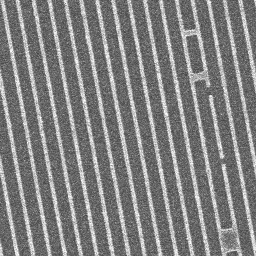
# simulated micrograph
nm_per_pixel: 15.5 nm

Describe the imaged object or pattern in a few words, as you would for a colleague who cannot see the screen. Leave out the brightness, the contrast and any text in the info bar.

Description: parallel lines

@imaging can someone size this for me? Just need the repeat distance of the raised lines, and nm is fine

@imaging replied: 242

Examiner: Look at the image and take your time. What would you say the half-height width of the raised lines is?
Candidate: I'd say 39.9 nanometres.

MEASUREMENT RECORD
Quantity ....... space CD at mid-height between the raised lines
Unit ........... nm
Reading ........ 198